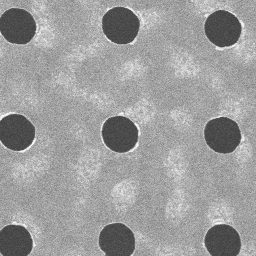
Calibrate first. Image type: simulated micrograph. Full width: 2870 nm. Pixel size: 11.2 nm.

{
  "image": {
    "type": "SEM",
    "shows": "holes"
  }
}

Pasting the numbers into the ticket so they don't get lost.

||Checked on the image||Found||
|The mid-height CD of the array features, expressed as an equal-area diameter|414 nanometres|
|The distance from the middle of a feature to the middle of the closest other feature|1150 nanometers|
